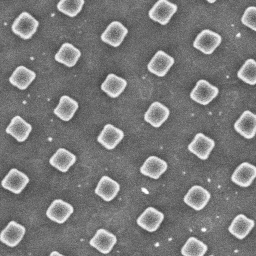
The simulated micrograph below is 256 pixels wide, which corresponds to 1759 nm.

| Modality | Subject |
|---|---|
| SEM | a regular array of raised bodies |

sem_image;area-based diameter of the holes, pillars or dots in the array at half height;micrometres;0.152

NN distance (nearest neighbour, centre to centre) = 352 nanometers